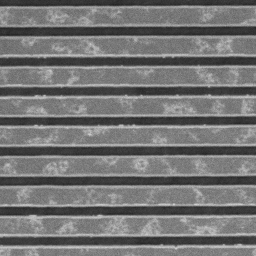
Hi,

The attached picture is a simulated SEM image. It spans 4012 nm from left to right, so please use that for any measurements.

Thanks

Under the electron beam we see parallel lines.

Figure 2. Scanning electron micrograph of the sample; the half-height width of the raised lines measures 0.311 microns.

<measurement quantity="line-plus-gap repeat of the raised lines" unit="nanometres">469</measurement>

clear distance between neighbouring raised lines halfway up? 157 nanometers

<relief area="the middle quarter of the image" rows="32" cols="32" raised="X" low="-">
--------------------------------
XXXXXXXXXXXXXXXXXXXXXXXXXXXXXXXX
XXXXXXXXXXXXXXXXXXXXXXXXXXXXXXXX
XXXXXXXXXXXXXXXXXXXXXXXXXXXXXXXX
XXXXXXXXXXXXXXXXXXXXXXXXXXXXXXXX
-----------------X-XXX-XXXXX----
--------------------------------
--------------------------------
XXXXXXXXXXXXXXXXXXXXXXXXXXXXXXXX
XXXXXXXXXXXXXXXXXXXXXXXXXXXXXXXX
XXXXXXXXXXXXXXXXXXXXXXXXXXXXXXXX
XXXXXXXXXXXXXXXXXXXXXXXXXXXXXXXX
XXXXXXXXXXXXXXXXXXXXXXXXXXXXXXXX
--------------------------------
--------------------------------
----------------------XXXX------
XXXXXXXXXXXXXXXXXXXXXXXXXXXXXXXX
XXXXXXXXXXXXXXXXXXXXXXXXXXXXXXXX
XXXXXXXXXXXXXXXXXXXXXXXXXXXXXXXX
XXXXXXXXXXXXXXXXXXXXXXXXXXXXXXXX
--------------------------------
--------------------------------
--------------------------------
XXXXXXXXXXXXXXXXXXXXXXXXXXXXXXXX
XXXXXXXXXXXXXXXXXXXXXXXXXXXXXXXX
XXXXXXXXXXXXXXXXXXXXXXXXXXXXXXXX
XXXXXXXXXXXXXXXXXXXXXXXXXXXXXXXX
XXXXXXXXXXXXXXXXXXXXXXXXXXXXXXXX
--------------------------------
--------------------------------
--------------------------------
XXXXXXXXXXXXXXXXXXXXXXXXXXXXXXXX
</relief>